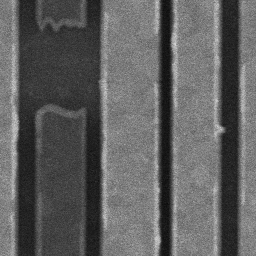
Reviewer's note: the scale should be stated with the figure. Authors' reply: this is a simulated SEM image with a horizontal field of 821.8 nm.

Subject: one or a few lines or trenches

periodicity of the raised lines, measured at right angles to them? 66.6 px